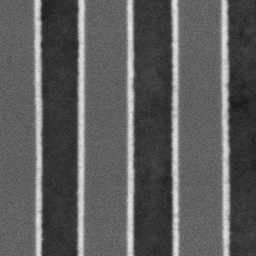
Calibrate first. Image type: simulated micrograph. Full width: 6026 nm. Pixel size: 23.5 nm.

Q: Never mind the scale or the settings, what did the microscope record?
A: lines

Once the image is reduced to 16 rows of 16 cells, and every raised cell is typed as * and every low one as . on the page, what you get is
**...***...***..
**...***...***..
**...***...***..
**...***...***..
**...***...***..
**...***...***..
**...***...***..
**...***...***..
**...***...***..
**...***...***..
**...***...***..
**...***...***..
**...***...***..
**...***...***..
**...***...***..
**...***...***..